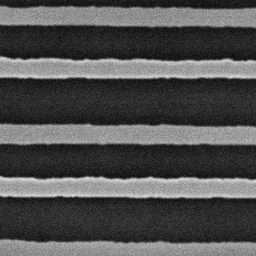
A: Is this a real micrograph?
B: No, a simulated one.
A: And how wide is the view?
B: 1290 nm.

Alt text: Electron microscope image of lines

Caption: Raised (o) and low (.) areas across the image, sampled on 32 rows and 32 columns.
................................
oooooooooooooooooooooooooooooooo
oooooooooooooooooooooooooooooooo
................................
................................
................................
................................
ooooooooo...ooo.oo.o.......oo...
oooooooooooooooooooooooooooooooo
oooooooooooooooooooooooooooooooo
................................
................................
................................
................................
................................
................................
oooooooooooooooooooooooooooooooo
oooooooooooooooooooooooooooooooo
................................
................................
................................
................................
ooooo.ooooooooooooooooooooooooo.
oooooooooooooooooooooooooooooooo
ooooooo.oooooooooooooooooooooooo
................................
................................
................................
................................
................................
oooooooooooooooooooooooooooooooo
oooooooooooooooooooooooooooooooo